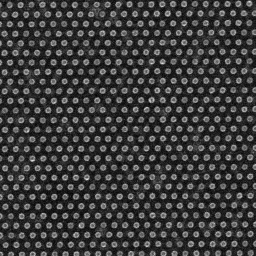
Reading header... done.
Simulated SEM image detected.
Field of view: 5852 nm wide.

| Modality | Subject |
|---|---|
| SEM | a regular array of raised bodies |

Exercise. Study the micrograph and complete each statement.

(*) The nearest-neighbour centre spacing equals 0.245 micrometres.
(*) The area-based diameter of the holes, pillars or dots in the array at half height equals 124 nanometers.